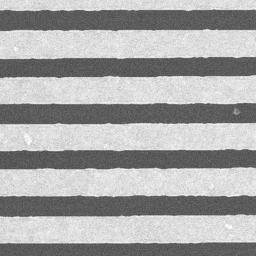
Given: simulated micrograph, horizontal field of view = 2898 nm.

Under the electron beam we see lines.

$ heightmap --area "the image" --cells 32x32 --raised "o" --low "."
oooooooooooooooooooooooooooooooo
................................
................................
................................
oooooooooooooooooooooooooooooooo
oooooooooooooooooooooooooooooooo
oooooooooooooooooooooooooooooooo
................................
................................
...............................o
oooooooooooooooooooooooooooooooo
oooooooooooooooooooooooooooooooo
oooooooooooooooooooooooooooooooo
................................
................................
.......o.....o..oooooooooooooooo
oooooooooooooooooooooooooooooooo
oooooooooooooooooooooooooooooooo
oooooooooooooooooooooooooooooooo
................................
................................
oooooooooooooooooooooooooooooooo
oooooooooooooooooooooooooooooooo
oooooooooooooooooooooooooooooooo
............o.o.............o...
................................
................................
oooooooooooooooooooooooooooooooo
oooooooooooooooooooooooooooooooo
oooooooooooooooooooooooooooooooo
................................
................................